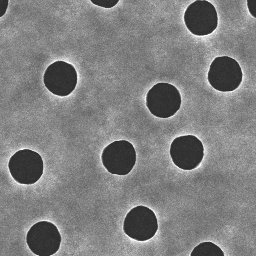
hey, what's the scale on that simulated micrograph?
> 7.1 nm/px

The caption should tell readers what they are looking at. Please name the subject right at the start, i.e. holes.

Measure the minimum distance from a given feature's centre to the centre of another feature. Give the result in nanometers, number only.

480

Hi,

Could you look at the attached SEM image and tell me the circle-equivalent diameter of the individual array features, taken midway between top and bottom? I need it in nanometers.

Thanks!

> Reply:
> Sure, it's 246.